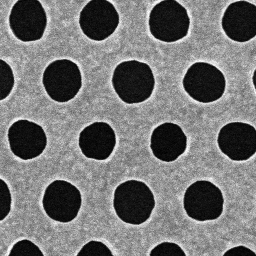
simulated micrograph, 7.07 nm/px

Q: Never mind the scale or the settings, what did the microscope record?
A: a regular array of holes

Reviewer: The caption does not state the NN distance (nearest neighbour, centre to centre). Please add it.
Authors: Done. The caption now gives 490 nanometres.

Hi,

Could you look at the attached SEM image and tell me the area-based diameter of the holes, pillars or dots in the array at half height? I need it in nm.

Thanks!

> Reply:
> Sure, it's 291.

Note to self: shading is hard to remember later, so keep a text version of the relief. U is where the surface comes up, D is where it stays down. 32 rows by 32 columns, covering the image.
UUDDDUUUUUUDDDUUUUUUDDDUUUUUUDDD
UDDDDDUUUUDDDDDUUUUDDDDUUUUUDDDD
UDDDDDUUUUDDDDDUUUUDDDDDUUUUDDDD
UDDDDDUUUUDDDDDUUUUDDDDDUUUUDDDD
UUDDDUUUUUUDDDUUUUUDDDDUUUUUDDDD
UUUUUUUUUUUUUUUUUUUUUUUUUUUUUUUU
UUUUUUUUUUUUUUUUUUUUUUUUUUUUUUUU
UUUUUUUDDUUUUUUUUUUUUUUUUUUUUUUU
DUUUUUDDDDUUUUDDDDDUUUUUDDDUUUUU
DDUUUDDDDDUUUUDDDDDUUUUDDDDDUUUU
DDUUUDDDDDUUUUDDDDDUUUUDDDDDUUUU
DUUUUUDDDDUUUUDDDDDUUUUDDDDDUUUU
UUUUUUUDDUUUUUUDDDUUUUUUDDDUUUUU
UUUUUUUUUUUUUUUUUUUUUUUUUUUUUUUU
UUUUUUUUUUUUUUUUUUUUUUUUUUUUUUUU
UUDDDUUUUUUDDDUUUUUUDDUUUUUUDDDU
UDDDDDUUUUDDDDUUUUUDDDDUUUUDDDDD
UDDDDDUUUUDDDDUUUUUDDDDUUUUDDDDD
UDDDDDUUUUDDDDUUUUUDDDDUUUUDDDDD
UUDDDUUUUUUDDDUUUUUDDDUUUUUUDDDU
UUUUUUUUUUUUUUUUUUUUUUUUUUUUUUUU
UUUUUUUUUUUUUUUUUUUUUUUUUUUUUUUU
UUUUUUUUUUUUUUUUUUUUUUUUUUUUUUUU
DUUUUUDDDDUUUUUDDDDUUUUDDDDUUUUU
DUUUUDDDDDUUUUDDDDDUUUUDDDDDUUUU
DUUUUDDDDDUUUUDDDDDUUUUDDDDDUUUU
DUUUUUDDDDUUUUDDDDDUUUUDDDDDUUUU
UUUUUUUDDUUUUUUDDDUUUUUUDDDUUUUU
UUUUUUUUUUUUUUUUUUUUUUUUUUUUUUUU
UUUUUUUUUUUUUUUUUUUUUUUUUUUUUUUU
UUDDUUUUUUUDDUUUUUUUDDUUUUUUUUUU
UDDDDUUUUUDDDDUUUUUDDDDUUUUUDDDD